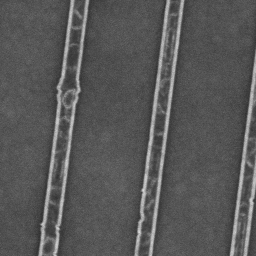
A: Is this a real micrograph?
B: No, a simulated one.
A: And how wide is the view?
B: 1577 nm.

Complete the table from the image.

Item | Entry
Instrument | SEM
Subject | one or a few lines or trenches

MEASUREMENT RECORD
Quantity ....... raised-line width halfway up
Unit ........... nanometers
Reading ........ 92.4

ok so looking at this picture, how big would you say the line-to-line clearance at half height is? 492 nanometres